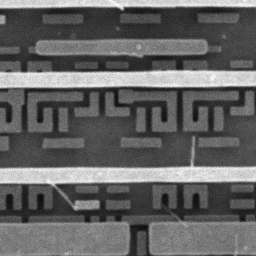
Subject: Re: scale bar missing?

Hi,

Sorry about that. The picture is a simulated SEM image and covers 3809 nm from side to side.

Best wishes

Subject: wiring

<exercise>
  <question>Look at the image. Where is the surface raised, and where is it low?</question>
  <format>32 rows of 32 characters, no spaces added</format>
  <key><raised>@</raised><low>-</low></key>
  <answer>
@@@@@@@@@@@@@@@@@@@@@@@@@@@@@@@@
--------------------------------
--------------------------------
--------------------------------
--------------------------------
-----@@@@@@@@@@@@@@@@@@@@@------
-----@@@@@@@@@@@@@@@@@@@@@------
--------------------------------
--------------------------------
@@@@@@@@@@@@@@@@@@@@@@@@@@@@@@@@
@@@@@@@@@@@@@@@@@@@@@@@@@@@@@@@@
--------------------------------
--------------------------------
--------------------------------
--------------------------------
--------------------------------
--------------------------------
--------------------------------
--------------------------------
--------------------------------
--------------------------------
@@@@@@@@@@@@@@@@@@@@@@@@@@@@@@@@
@@@@@@@@@@@@@@@@@@@@@@@@@@@@@@@@
--------------------------------
--------------------------------
--------------------------------
--------------------------------
--------------------------------
@@@@@@@@@@@@@@@@---@@@@@@@@@@@@@
@@@@@@@@@@@@@@@@---@@@@@@@@@@@@@
@@@@@@@@@@@@@@@@---@@@@@@@@@@@@@
@@@@@@@@@@@@@@@@---@@@@@@@@@@@@@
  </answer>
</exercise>